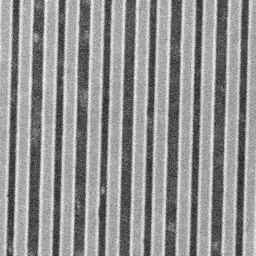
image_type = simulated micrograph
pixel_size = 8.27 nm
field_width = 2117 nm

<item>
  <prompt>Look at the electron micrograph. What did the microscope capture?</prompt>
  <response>parallel lines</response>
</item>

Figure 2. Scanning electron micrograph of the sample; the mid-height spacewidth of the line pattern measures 84.7 nanometres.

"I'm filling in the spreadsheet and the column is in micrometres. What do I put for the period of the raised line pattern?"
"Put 0.191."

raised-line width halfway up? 0.092 microns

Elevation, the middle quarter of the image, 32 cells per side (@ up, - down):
@@@----@@---@@@---@@@--@@@---@@@
@@@---@@@---@@@---@@@--@@@---@@@
@@@---@@@---@@@---@@@--@@@---@@@
@@@----@@---@@@---@@@--@@@---@@@
@@@----@@---@@@---@@@--@@@---@@@
@@@----@@---@@@---@@@--@@@---@@@
@@@----@@---@@----@@---@@@---@@@
@@@----@@---@@----@@---@@@---@@@
@@@----@@---@@----@@---@@@---@@@
@@@----@@---@@----@@---@@@---@@@
@@@---@@@---@@----@@---@@@---@@@
@@@---@@@---@@----@@---@@@---@@@
@@@---@@@---@@----@@---@@@---@@@
@@@---@@@---@@----@@---@@@---@@@
@@@---@@@---@@----@@---@@@---@@@
@@@---@@@--@@@----@@---@@@---@@@
@@@---@@@--@@@----@@---@@@---@@@
@@@---@@@--@@@----@@---@@@---@@@
@@@---@@@--@@@----@@---@@@---@@@
@@@---@@@--@@@----@@---@@@---@@@
@@@---@@@--@@@----@@---@@----@@@
@@@---@@@--@@@----@@---@@----@@@
@@@---@@@--@@@----@@---@@----@@@
@@----@@@--@@@---@@@---@@----@@@
@@----@@@--@@@---@@@---@@----@@@
@@----@@@--@@@---@@@---@@----@@@
@@----@@@--@@@---@@@---@@----@@@
@@----@@@--@@@---@@@---@@----@@@
@@----@@@--@@@---@@@---@@----@@-
@@----@@@--@@@---@@@--@@@----@@-
@@----@@@--@@@---@@@--@@@----@@-
@@----@@---@@@---@@@--@@@----@@-